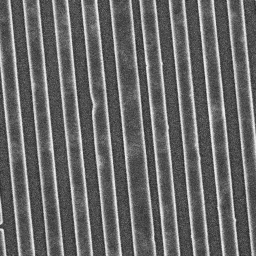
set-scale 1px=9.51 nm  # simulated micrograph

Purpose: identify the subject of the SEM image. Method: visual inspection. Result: parallel lines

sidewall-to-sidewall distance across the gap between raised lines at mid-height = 128 nanometres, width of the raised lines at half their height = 144 nm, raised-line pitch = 276 nanometers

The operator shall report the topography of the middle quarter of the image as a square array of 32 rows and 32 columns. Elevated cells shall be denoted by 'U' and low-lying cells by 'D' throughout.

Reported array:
UUDDDDUUUUDDDUUUUUDDDUUUUDDDUUUU
UUUDDDUUUUDDDUUUUUDDDUUUDDDDUUUU
UUUDDDUUUUDDDUUUUUDDDUUUUDDDUUUU
UUUDDDUUUUDDDUUUUUUDDUUUUDDDUUUU
UUUDDDUUUUDDDDUUUUUDDUUUUDDDUUUU
UUUDDDUUUUDDDDUUUUUDDUUUUDDDUUUU
UUUDDDDUUUDDDDUUUUUDDUUUUDDDDUUU
UUUDDDDUUUUDDDUUUUUDDUUUUDDDDUUU
UUUDDDDUUUUDDDUUUUUDDDUUUDDDDUUU
UUUDDDDUUUUDDDUUUUUDDDUUUDDDDUUU
UUUDDDDUUUUDDDUUUUUDDDUUUDDDDUUU
UUUUDDDUUUUDDDUUUUUDDDUUUDDDDUUU
UUUUDDDUUUUDDDUUUUUDDDUUUUDDDUUU
UUUUDDDUUUUDDDUUUUUUDDUUUUDDDUUU
UUUUDDDUUUUDDDDUUUUUDDUUUUDDDUUU
UUUUDDDUUUUDDDDUUUUUDDUUUUDDDUUU
UUUUDDDDUUUDDDDUUUUUDDUUUUDDDUUU
UUUUDDDDUUUDDDDUUUUUDDUUUUDDDDUU
DUUUDDDDUUUUDDDUUUUUDDDUUUDDDDUU
DUUUDDDDUUUUDDDUUUUUDDDUUUDDDDUU
DUUUDDDDUUUUDDDUUUUUDDDUUUDDDDUU
DUUUDDDDUUUUDDDUUUUUDDDUUUDDDDUU
DUUUUDDDUUUUDDDUUUUUDDDUUUUDDDUU
DUUUUDDDUUUUDDDUUUUUDDDUUUUDDDUU
DUUUUDDDUUUUDDDUUUUUUDDUUUUDDDUU
DUUUUDDDUUUUDDDDUUUUUDDUUUUDDDUU
DUUUUDDDDUUUDDDDUUUUUDDUUUUDDDUU
DUUUUDDDDUUUDDDDUUUUUDDUUUUDDDDU
DDUUUDDDDUUUDDDDUUUUUDDUUUUDDDDU
DDUUUDDDDUUUDDDDUUUUUDDDUUUDDDDU
DDUUUDDDDUUUUDDDUUUUUDDDUUUDDDDU
DDUUUDDDDUUUUDDDUUUUUDDDUUUDDDDU